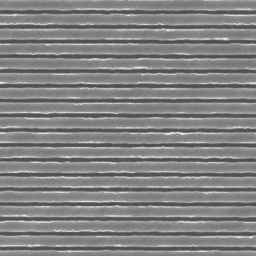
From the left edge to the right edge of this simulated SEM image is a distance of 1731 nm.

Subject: parallel lines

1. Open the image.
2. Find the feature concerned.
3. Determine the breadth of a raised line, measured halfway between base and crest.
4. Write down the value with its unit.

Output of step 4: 73.5 nm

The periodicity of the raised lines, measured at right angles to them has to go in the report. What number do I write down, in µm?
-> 0.0998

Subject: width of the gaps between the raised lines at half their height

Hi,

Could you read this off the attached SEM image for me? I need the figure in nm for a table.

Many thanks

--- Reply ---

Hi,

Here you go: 24.5